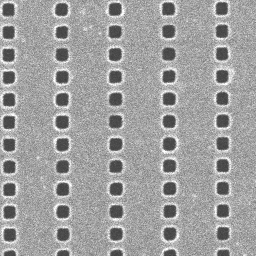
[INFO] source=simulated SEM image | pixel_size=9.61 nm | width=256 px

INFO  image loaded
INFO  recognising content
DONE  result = a regular array of holes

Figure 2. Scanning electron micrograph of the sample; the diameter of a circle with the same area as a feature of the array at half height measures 139 nanometres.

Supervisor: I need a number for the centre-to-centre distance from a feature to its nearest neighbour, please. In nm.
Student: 215